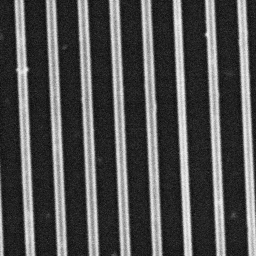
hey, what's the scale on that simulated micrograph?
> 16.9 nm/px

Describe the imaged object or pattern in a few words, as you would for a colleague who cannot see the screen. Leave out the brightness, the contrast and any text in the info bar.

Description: parallel lines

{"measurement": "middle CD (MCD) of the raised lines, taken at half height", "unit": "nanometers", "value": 118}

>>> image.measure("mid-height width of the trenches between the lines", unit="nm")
421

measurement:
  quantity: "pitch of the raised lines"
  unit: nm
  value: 536